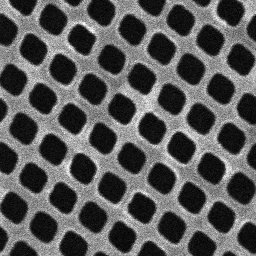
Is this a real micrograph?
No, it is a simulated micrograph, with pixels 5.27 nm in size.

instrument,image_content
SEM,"a regular array of holes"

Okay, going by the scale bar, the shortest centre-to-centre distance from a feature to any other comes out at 185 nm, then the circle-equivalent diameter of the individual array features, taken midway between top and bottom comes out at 29.1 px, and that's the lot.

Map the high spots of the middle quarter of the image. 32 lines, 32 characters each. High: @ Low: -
---@@@@@@------@@----@@@@@@@----
---@@@@@@@-----@@-----@@@@@@----
---@@@-@@@@@--@@-------@@@@@----
---@@----@@@@@@@-------@@@@@@---
--@@------@@@@@@-------@@@@@@@@-
@@@@-------@@@@@@-----@@@---@@@@
@@@--------@@@@@@@----@@-----@@@
@@@@-------@@--@@@@--@@@------@@
@@@@@-----@@----@@@@@@@--------@
@@@@@@---@@------@@@@@@-------@@
---@@@@@@@@-------@@@@@@------@@
-----@@@@@@-------@@@@@@@-----@-
-----@@@@@@-------@@---@@@---@@-
------@@@@@@-----@@-----@@@@@@@-
------@@@@@@@----@@------@@@@@@-
-----@@----@@@@@@@--------@@@@@-
-----@@-----@@@@@@@-------@@@@@@
@@--@@-------@@@@@@------@@@--@@
@@@@@@-------@@@@@@@-----@@----@
@@@@@@-------@@@@@@@@---@@------
-@@@@@@------@@---@@@@@@@@------
-@@@@@@@----@@-----@@@@@@@------
-@@--@@@@--@@-------@@@@@@------
@@----@@@@@@@--------@@@@@@-----
@@-----@@@@@@@------@@@-@@@@@--@
@-------@@@@@@------@@----@@@@@@
@-------@@@@@@@----@@@-----@@@@@
@@------@@---@@@@--@@-------@@@@
@@-----@@-----@@@@@@@-------@@@@
@@@@---@@------@@@@@@-------@@@-
-@@@@@@@--------@@@@@@-----@@@--
---@@@@@--------@@@@@@@----@@---